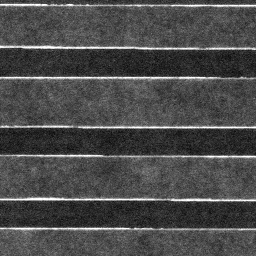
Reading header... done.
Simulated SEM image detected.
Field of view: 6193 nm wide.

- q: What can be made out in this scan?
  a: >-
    lines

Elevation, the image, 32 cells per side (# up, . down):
................................
################################
################################
################################
################################
################################
................................
................................
................................
................................
################################
################################
################################
################################
################################
################################
................................
................................
................................
#############...................
################################
################################
################################
################################
################################
................................
................................
................................
................................
################################
################################
################################